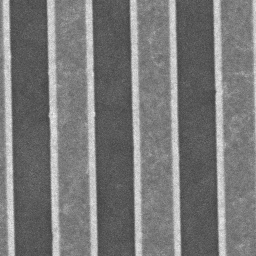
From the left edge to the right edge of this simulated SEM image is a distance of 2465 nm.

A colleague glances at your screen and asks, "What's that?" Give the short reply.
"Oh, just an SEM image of one or a few lines or trenches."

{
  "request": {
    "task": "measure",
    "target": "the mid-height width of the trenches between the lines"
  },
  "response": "432 nm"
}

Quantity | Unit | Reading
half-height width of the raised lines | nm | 371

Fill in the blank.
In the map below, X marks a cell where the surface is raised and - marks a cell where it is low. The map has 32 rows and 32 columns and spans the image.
X-----XXXXX------XXXX------XXXXX
X-----XXXXX------XXXX------XXXXX
X-----XXXXX------XXXX------XXXXX
X-----XXXXX------XXXX------XXXXX
X-----XXXXX------XXXXX-----XXXXX
X-----XXXXX------XXXXX-----XXXXX
X------XXXX------XXXXX-----XXXXX
X------XXXX------XXXXX-----XXXXX
X------XXXX------XXXXX-----XXXXX
X------XXXX------XXXXX-----XXXXX
X------XXXX------XXXXX-----XXXXX
X------XXXX------XXXXX-----XXXXX
X------XXXX------XXXXX-----XXXXX
X------XXXX------XXXXX-----XXXXX
X------XXXX------XXXXX-----XXXXX
X------XXXX------XXXXX-----XXXXX
X------XXXX------XXXXX-----XXXXX
X------XXXX------XXXXX------XXXX
X------XXXX------XXXXX------XXXX
X------XXXX------XXXXX------XXXX
X------XXXX------XXXXX------XXXX
X------XXXXX-----XXXXX------XXXX
X------XXXXX-----XXXXX------XXXX
X------XXXXX-----XXXXX------XXXX
X------XXXXX-----XXXXX------XXXX
X------XXXXX-----XXXXX------XXXX
X------XXXXX-----XXXXX------XXXX
X------XXXXX-----XXXXX------XXXX
X------XXXXX-----XXXXX------XXXX
X------XXXXX-----XXXXX------XXXX
X------XXXXX-----XXXXX------XXXX
X------XXXXX-----XXXXX------XXXX